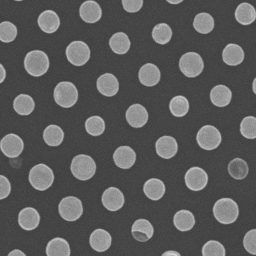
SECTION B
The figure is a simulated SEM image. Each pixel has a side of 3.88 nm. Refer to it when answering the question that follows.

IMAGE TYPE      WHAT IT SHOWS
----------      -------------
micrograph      a regular array of raised bodies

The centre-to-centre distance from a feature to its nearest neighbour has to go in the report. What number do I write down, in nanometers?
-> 166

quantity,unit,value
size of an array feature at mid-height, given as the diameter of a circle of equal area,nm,85.2